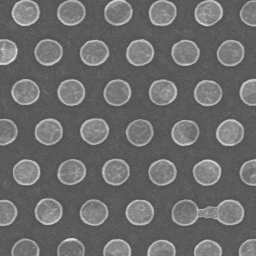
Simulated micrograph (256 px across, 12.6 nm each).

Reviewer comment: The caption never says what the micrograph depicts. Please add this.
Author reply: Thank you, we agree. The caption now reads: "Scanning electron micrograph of a regular array of raised bodies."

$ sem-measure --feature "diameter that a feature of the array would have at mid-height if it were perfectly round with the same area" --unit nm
325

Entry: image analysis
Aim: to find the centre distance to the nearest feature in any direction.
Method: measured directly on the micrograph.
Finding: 571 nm